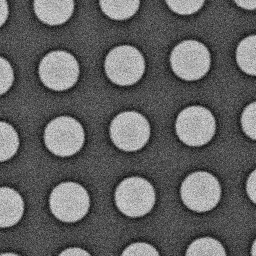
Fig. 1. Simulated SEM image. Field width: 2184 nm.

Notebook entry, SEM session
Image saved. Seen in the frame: an array of small figures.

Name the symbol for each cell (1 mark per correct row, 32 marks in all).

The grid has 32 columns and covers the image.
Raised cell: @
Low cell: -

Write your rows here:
@---@@@@@----@@@@----@@@@-----@@
@---@@@@@----@@@@-----@@--------
@----@@@------------------------
--------------------------------
-------------------------------@
----------------------@@@-----@@
-------@------@@@-----@@@@----@@
@----@@@@----@@@@@---@@@@@----@@
@----@@@@@---@@@@@----@@@@----@@
@@---@@@@@----@@@@----@@@-------
@-----@@@------@----------------
@-------------------------------
--------------------------------
-----------------------@@------@
---------------@@@----@@@@@---@@
@-----@@@@----@@@@@---@@@@@---@@
@@----@@@@----@@@@@---@@@@@----@
@@----@@@@----@@@@-----@@@------
@@----@@@@-----@@---------------
@@------------------------------
--------------------------------
--------------------------------
----------------@@-----@@@@----@
@------@@@-----@@@@----@@@@----@
@@----@@@@@---@@@@@----@@@@----@
@@@---@@@@@----@@@@----@@@@-----
@@@----@@@@----@@@--------------
@@------@@----------------------
--------------------------------
--------------------------------
-----------------@------@@@@----
--------@@@----@@@@@---@@@@@---@